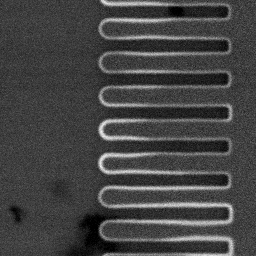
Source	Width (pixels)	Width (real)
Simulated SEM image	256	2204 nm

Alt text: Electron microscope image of groups of lines, slits or small figures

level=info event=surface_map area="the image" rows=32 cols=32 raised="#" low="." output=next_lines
....................############
.............................###
....................############
.............###################
.............###################
.............................###
............................####
.............###################
.............###################
.............................###
............................####
.............###################
.............###################
.............................###
.............................###
.............###################
.............###################
............................####
.............................###
.............###################
.............###################
.............##...##############
.............................###
.............####....###########
.............###################
.............###################
.............................###
.............................###
.............###################
.............###################
.............................###
.............................###